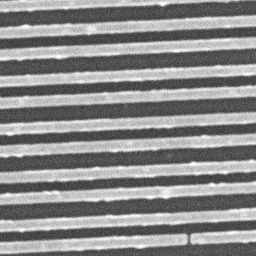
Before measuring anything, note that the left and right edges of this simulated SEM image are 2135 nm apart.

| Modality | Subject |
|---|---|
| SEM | parallel lines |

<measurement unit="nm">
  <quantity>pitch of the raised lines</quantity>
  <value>199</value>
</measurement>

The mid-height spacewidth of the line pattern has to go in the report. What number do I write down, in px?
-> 12.5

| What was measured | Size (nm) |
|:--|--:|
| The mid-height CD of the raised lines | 81.2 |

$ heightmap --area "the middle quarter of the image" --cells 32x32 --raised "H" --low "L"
LLLLLLLLLLLLLLLLLLLLLLLLLLLLLLLL
LLLLLLLLLLLLLLLLLLLLHHHHHHHHHHHH
LLLHHHHHHHHHHHHHHHHHHHHHHHHHHHHH
HHHHHHHHHHHHHHHHHHHHHHHHHLLLLLLL
HHHHHHHLLLLLLLLLLLLLLLLLLLLLLLLL
LLLLLLLLLLLLLLLLLLLLLLLLLLLLLLLL
LLLLLLLLLLLLLLLLLLLLLLLLLLLLLLLH
LLLLLLLLLLHHHHHHHHHHHHHHHHHHHHHH
HHHHHHHHHHHHHHHHHHHHHHHHHHHHHHHH
HHHHHHHHHHHHHHHLLLLLLLLLLLLLLLLL
LLLLLLLLLLLLLLLLLLLLLLLLLLLLLLLL
LLLLLLLLLLLLLLLLLLLLLLLLLLLLLLLL
LLLLLLLLLLLLLLLLLLLLLLLLLLLLLLLL
LLLLLLLLLLLLLLLLLLLLHLLHHHHHHHHH
LLLHHHHHHHHHHHHHHHHHHHHHHHHHHHHH
HHHHHHHHHHHHHHHHHHHHHHHHHHHHLLLL
HHHHHHHHLLLLLLLLLLLLLLLLLLLLLLLL
LLLLLLLLLLLLLLLLLLLLLLLLLLLLLLLL
LLLLLLLLLLLLLLLLLLLLLLLLLLLLLLLH
LLLLLLLLLLHHHHHHHHHHHHHHHHHHHHHH
HHHHHHHHHHHHHHHHHHHHHHHHHHHHHHHH
HHHHHHHHHHHHHHHHHHHHLLLLLLLLLLLL
LLLLLLLLLLLLLLLLLLLLLLLLLLLLLLLL
LLLLLLLLLLLLLLLLLLLLLLLLLLLLLLLL
LLLLLLLLLLLLLLLLLLLLLLLLLLLLLLLL
LLLLLLLLLLLLLLLLLLLLLLHHHHHHHHHH
LLLHHHHHHHHHHHHHHHHHHHHHHHHHHHHH
HHHHHHHHHHHHHHHHHHHHHHHHHHHHHLLL
HHHHHHHHLLLLLLLLLLLLLLLLLLLLLLLL
LLLLLLLLLLLLLLLLLLLLLLLLLLLLLLLL
LLLLLLLLLLLLLLLLLLLLLLLLLLLLLLLH
LLLLLLLLLLHHHHHHHHHHHHHHHHHHHHHH